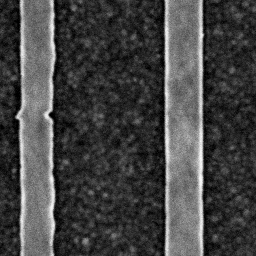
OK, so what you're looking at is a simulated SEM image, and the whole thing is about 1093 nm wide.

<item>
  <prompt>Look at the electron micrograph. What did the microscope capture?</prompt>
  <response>one or a few lines or trenches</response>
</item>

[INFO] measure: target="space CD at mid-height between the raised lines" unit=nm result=485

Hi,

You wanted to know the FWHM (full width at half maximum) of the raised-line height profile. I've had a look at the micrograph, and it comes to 144 nm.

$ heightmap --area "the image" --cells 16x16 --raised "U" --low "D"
DUUDDDDDDDUUUDDD
DUUDDDDDDDUUUDDD
DUUDDDDDDDUUUDDD
DUUDDDDDDDUUUDDD
DUUDDDDDDDUUUDDD
DUUDDDDDDDUUUDDD
DUUDDDDDDDUUUDDD
DUUDDDDDDDUUUDDD
DUUDDDDDDDUUUDDD
DUUDDDDDDDUUUDDD
DUUDDDDDDDUUUDDD
DUUDDDDDDDUUUDDD
DUUDDDDDDDUUUDDD
DUUDDDDDDDUUUDDD
DUUDDDDDDDUUUDDD
DUUDDDDDDDUUUDDD